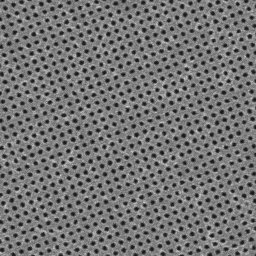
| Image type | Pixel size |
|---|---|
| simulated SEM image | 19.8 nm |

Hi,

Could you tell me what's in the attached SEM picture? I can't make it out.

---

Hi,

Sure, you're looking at a regular array of holes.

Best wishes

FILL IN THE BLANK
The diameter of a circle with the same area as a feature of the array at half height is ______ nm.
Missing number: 105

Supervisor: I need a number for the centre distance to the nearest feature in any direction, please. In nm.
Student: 167